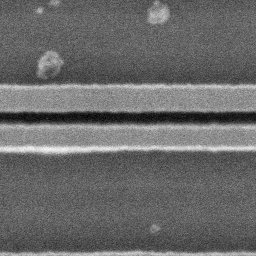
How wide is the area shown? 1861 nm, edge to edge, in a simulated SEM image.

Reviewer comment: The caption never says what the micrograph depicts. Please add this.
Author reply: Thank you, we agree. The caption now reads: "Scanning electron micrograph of lines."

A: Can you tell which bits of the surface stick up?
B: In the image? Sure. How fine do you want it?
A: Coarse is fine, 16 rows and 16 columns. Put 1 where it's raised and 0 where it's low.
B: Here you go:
0000000000000000
0000000000000000
0000000000000000
0000000000000000
0000000000000000
1111111111111111
1111111111111111
1111111111111111
1111111111111111
0000000000000000
0000000000000000
0000000000000000
0000000000000000
0000000000000000
0000000000000000
0000000000000000